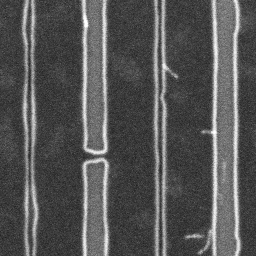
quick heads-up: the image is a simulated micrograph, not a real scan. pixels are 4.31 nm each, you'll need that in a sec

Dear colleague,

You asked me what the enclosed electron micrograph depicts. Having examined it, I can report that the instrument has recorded one or a few lines or trenches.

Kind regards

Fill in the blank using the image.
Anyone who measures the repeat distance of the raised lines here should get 65.1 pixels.